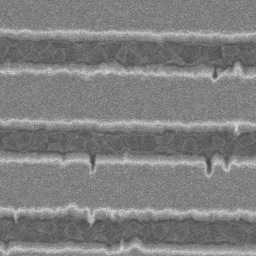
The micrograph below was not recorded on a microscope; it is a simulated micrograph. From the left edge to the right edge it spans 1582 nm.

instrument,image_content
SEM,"one or a few lines or trenches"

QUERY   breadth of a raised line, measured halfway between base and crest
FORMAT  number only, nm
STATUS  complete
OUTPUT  348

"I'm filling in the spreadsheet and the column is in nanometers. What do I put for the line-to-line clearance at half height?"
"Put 202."